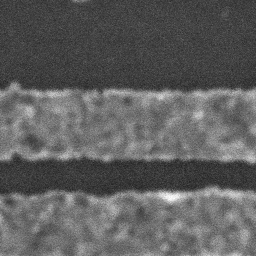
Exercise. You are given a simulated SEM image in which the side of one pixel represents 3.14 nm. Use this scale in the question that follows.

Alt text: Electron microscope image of one or a few lines or trenches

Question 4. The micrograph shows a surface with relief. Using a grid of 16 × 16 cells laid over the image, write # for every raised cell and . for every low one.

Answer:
................
................
................
................
................
................
################
################
################
################
................
................
################
################
################
################